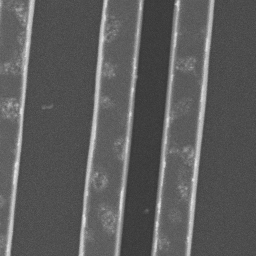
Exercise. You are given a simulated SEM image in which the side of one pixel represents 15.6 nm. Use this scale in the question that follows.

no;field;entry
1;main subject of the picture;one or a few lines or trenches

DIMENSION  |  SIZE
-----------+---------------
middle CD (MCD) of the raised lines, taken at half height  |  573 nm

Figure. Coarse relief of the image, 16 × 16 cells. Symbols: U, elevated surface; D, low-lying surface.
UUDDDDUUUDDUUDDD
UUDDDDUUUDDUUDDD
UUDDDDUUUDDUUDDD
UUDDDDUUUDDUUDDD
UUDDDDUUDDDUUDDD
UUDDDDUUDDDUUDDD
UDDDDDUUDDUUUDDD
UDDDDDUUDDUUUDDD
UDDDDDUUDDUUUDDD
UDDDDDUUDDUUDDDD
UDDDDDUUDDUUDDDD
UDDDDUUUDDUUDDDD
UDDDDUUUDDUUDDDD
UDDDDUUUDDUUDDDD
UDDDDUUUDDUUDDDD
UDDDDUUDDDUUDDDD